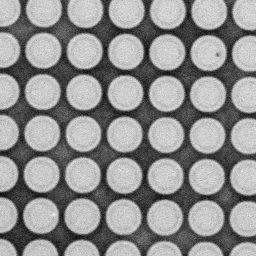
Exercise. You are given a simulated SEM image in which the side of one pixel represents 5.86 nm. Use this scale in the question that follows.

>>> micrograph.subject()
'an array of small figures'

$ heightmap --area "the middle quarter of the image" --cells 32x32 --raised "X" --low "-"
---XXXXX-----XXXXX-----XXXXXX---
--------------------------------
--------------------------------
--XXXXX------XXXXX------XXXX----
-XXXXXXXX---XXXXXXX---XXXXXXX---
-XXXXXXXX--XXXXXXXX---XXXXXXXX--
-XXXXXXXX--XXXXXXXXX-XXXXXXXXX--
-XXXXXXXX--XXXXXXXXX-XXXXXXXXX--
-XXXXXXXX--XXXXXXXXX-XXXXXXXXX--
-XXXXXXXX--XXXXXXXX---XXXXXXXX--
--XXXXXX----XXXXXX----XXXXXXX---
--------------XX--------XXXX----
--------------------------------
---XXXX-------XXX-------XXX-----
--XXXXXX----XXXXXX-----XXXXXX---
-XXXXXXXX--XXXXXXXX---XXXXXXX---
-XXXXXXXX--XXXXXXXX--XXXXXXXXX--
-XXXXXXXX--XXXXXXXX--XXXXXXXXX-X
-XXXXXXXX--XXXXXXXX--XXXXXXXXX-X
-XXXXXXXX--XXXXXXXX--XXXXXXXXX--
--XXXXXX----XXXXXXX---XXXXXXX---
---XXXX------XXXX------XXXXX----
--------------------------------
----XX--------------------------
--XXXXXX----XXXXXX-----XXXXX----
-XXXXXXXX--XXXXXXXX---XXXXXXX---
XXXXXXXXX--XXXXXXXX--XXXXXXXXX--
XXXXXXXXX--XXXXXXXX--XXXXXXXXX-X
XXXXXXXXX--XXXXXXXX--XXXXXXXXX-X
-XXXXXXXX--XXXXXXXX--XXXXXXXXX-X
-XXXXXXX---XXXXXXXX---XXXXXXX---
--XXXXX-----XXXXXX----XXXXXX----